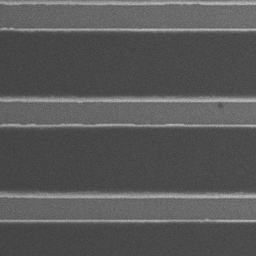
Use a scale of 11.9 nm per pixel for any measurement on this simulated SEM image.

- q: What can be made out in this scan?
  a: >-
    lines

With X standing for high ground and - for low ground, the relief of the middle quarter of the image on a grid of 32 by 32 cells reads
XXXXXXXXXXXXXXXXXXXXXXXXXXXXXXXX
XXXXXXXXXXXXXXXXXXXXXXXXXXXXXXXX
XXXXXXXXXXXXXXXXXXXXXXXXXXXXXXXX
XXXXXXXXXXXXXXXXXXXXXXXXXXXXXXXX
XXXXXXXXXXXXXXXXXXXXXXXXXXXXXXXX
XXXXXXXXXXXXXXXXXXXXXXXXXXXXXXXX
XXXXXXXXXXXXXXXXXXXXXXXXXXXXXXXX
XXXXXXXXXXXXXXXXXXXXXXXXXXXXXXXX
XXXXXXXXXXXXXXXXXXXXXXXXXXXXXXXX
--------------------------------
--------------------------------
--------------------------------
--------------------------------
--------------------------------
--------------------------------
XXXXXXXXXXXXXXXXXXXXXXXXXXXXXXXX
XXXXXXXXXXXXXXXXXXXXXXXXXXXXXXXX
XXXXXXXXXXXXXXXXXXXXXXXXXXXXXXXX
XXXXXXXXXXXXXXXXXXXXXXXXXXXXXXXX
XXXXXXXXXXXXXXXXXXXXXXXXXXXXXXXX
XXXXXXXXXXXXXXXXXXXXXXXXXXXXXXXX
XXXXXXXXXXXXXXXXXXXXXXXXXXXXXXXX
XXXXXXXXXXXXXXXXXXXXXXXXXXXXXXXX
XXXXXXXXXXXXXXXXXXXXXXXXXXXXXXXX
XXXXXXXXXXXXXXXXXXXXXXXXXXXXXXXX
XXXXXXXXXXXXXXXXXXXXXXXXXXXXXXXX
XXXXXXXXXXXXXXXXXXXXXXXXXXXXXXXX
XXXXXXXXXXXXXXXXXXXXXXXXXXXXXXXX
XXXXXXXXXXXXXXXXXXXXXXXXXXXXXXXX
XXXXXXXXXXXXXXXXXXXXXXXXXXXXXXXX
XXXXXXXXXXXXXXXXXXXXXXXXXXXXXXXX
XXXXXXXXXXXXXXXXXXXXXXXXXXXXXXXX